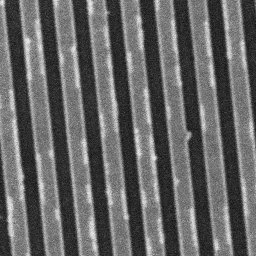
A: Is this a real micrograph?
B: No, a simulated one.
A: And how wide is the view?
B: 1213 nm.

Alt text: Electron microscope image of parallel lines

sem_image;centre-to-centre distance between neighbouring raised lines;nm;159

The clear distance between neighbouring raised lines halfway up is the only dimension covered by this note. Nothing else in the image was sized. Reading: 0.0807 micrometres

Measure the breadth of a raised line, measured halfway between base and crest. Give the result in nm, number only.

78.1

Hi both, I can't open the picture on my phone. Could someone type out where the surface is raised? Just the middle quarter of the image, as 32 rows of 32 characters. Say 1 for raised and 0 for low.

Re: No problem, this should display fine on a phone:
11100000111100001111000001111000
11100000111100001111000001111000
11110000111100001111000001111000
11110000111100001111000001111000
11110000111100000111000001111000
11110000111100000111100001111000
11110000111100000111100001111000
11110000011110000111100001111000
11110000011110000111100000111000
11110000011110000111100000111000
11110000011110000111100000111100
11111000011110000111100000111100
01111000011110000111100000111100
01111000011110000111110000111100
01111000011110000011110000111100
01111000011110000011110000111100
01111000011111000011110000111100
01111000011110000011110000111110
01111000001111000011110000011110
01111000001111000011110000011110
01111000001111000011110000011110
01111100001111000011110000011110
00111100001111000011111000011110
00111100001111000001111000011110
00111100001111000001111000011110
00111100001111000001111000011110
00111100000111000001111000011110
00111100000111000001111000011110
00111100000111100001111000001110
00111100000111100001111000001111
00111100000111100001111000001111
00111110000111100001111000001111